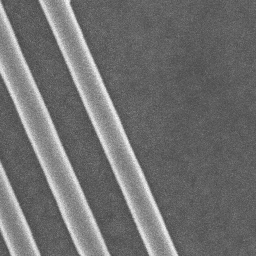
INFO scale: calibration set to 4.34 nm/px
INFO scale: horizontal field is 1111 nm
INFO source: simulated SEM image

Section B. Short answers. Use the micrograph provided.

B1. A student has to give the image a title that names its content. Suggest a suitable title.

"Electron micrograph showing one or a few lines or trenches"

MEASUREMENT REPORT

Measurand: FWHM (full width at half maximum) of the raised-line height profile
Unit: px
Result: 24.8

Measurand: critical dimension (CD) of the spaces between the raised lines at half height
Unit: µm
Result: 0.167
